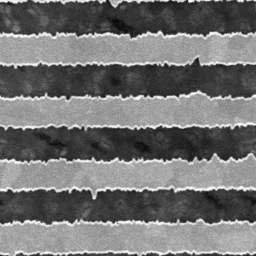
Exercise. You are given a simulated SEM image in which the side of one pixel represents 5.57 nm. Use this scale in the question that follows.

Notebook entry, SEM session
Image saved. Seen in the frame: one or a few lines or trenches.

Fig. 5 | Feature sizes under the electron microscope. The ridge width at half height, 0.162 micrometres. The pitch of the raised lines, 350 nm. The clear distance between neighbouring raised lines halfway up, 188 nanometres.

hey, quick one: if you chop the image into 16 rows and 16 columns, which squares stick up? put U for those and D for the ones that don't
DDDDDDDDDDDDDDDD
DDDDDDDDDDDDDDDD
UUUUUUUUUUUUUUUU
UUUUUUUUUUUUUUUU
DDDDDDDDDDDDDDDD
DDDDDDDDDDDDDDDD
UUUUUUUUUUUUUUUU
UUUUUUUUUUUUUUUU
DDDDDDDDDDDDDDDD
DDDDDDDDDDDDDDDD
UUUUUUUUUUUUUUUU
UUUUUUUUUUUUUUUU
DDDDDDDDDDDDDDDD
DDDDDDDDDDDDDDDD
UUUUUUUUUUUUUUUU
UUUUUUUUUUUUUUUU